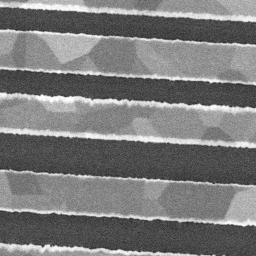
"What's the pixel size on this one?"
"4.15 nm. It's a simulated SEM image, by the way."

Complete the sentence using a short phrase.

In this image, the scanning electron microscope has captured lines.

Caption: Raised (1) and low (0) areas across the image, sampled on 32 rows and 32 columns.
11111111111111111111111111111111
00000000000000111111111111111111
00000000000000000000000000000001
00000000000000000000000000000000
11111111111100000000000000000000
11111111111111111111111111111100
11111111111111111111111111111111
11111111111111111111111111111111
11111111111111111111111111111111
00000000000000111111111111111111
00000000000000000000000000000001
00000000000000000000000000000000
11111111111111000000000000000000
11111111111111111111111111111100
11111111111111111111111111111111
11111111111111111111111111111111
00111111111111111111111111111111
00000000000000000111111111111111
00000000000000000000000000000000
00000000000000000000000000000000
00000000000000000000000000000000
11110000000000000000000000000000
11111111111111111111000000000000
11111111111111111111111111111111
11111111111111111111111111111111
11111111111111111111111111111111
00001111111111111111111111111111
00000000000000000010111111111111
00000000000000000000000000000000
00000000000000000000000000000000
00000000000000000000000000000000
11111111111111111000000000000000